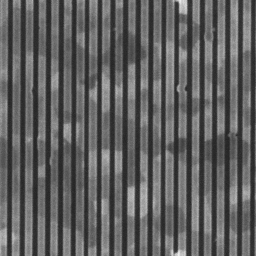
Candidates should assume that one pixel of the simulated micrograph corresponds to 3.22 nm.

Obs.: parallel lines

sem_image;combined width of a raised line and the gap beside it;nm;41.1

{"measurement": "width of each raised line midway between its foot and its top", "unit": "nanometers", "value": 22.1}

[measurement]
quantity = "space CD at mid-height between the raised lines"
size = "18.9 nanometres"